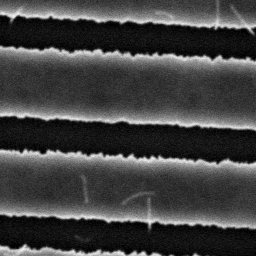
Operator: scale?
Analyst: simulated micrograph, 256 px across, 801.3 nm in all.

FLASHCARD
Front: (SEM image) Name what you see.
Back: lines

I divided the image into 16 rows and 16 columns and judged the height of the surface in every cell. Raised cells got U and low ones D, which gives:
UUUUUUUUUUUUUUUU
DDDDDDDDDDUUUUUU
DDDDDDDDDDDDDDDD
UUUUUUUUUUUDDDDD
UUUUUUUUUUUUUUUU
UUUUUUUUUUUUUUUU
UUUUUUUUUUUUUUUU
DDDDDUUUUUUUUUUU
DDDDDDDDDDDDDDDD
UUDDDDDDDDDDDDDD
UUUUUUUUUUUUUUUU
UUUUUUUUUUUUUUUU
UUUUUUUUUUUUUUUU
DDUUUUUUUUUUUUUU
DDDDDDDDDDDDDDDD
UDDDDDDDDDDDDDDD